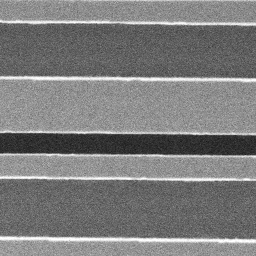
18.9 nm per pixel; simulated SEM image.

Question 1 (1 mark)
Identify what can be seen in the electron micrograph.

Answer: lines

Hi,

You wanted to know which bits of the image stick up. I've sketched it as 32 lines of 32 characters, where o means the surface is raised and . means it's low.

oooooooooooooooooooooooooooooooo
oooooooooooooooooooooooooooooooo
oooooooooooooooooooooooooooooooo
................................
................................
................................
................................
................................
................................
................................
oooooooooooooooooooooooooooooooo
oooooooooooooooooooooooooooooooo
oooooooooooooooooooooooooooooooo
oooooooooooooooooooooooooooooooo
oooooooooooooooooooooooooooooooo
oooooooooooooooooooooooooooooooo
oooooooooooooooooooooooooooooooo
................................
................................
ooooooooooooooooooooo...........
oooooooooooooooooooooooooooooooo
oooooooooooooooooooooooooooooooo
................................
................................
................................
................................
................................
................................
................................
................................
oooooooooooooooooooooooooooooooo
oooooooooooooooooooooooooooooooo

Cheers